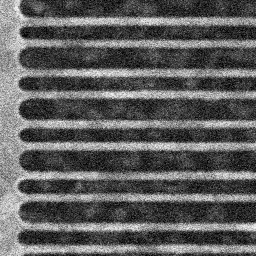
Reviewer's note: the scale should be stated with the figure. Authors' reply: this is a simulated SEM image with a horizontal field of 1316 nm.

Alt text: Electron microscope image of parallel lines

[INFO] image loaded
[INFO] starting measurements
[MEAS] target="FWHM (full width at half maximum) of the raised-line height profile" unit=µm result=0.0308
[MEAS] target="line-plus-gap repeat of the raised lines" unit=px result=25.2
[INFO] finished